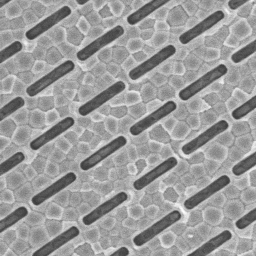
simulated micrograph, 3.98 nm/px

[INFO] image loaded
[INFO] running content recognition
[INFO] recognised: a regular array of holes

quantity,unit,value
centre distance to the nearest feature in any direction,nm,218